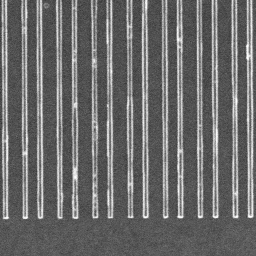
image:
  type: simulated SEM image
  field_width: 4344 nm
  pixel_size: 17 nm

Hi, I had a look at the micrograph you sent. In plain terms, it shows parallel lines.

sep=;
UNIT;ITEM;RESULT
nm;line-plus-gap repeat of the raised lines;297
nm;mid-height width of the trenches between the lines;227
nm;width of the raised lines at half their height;72.1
